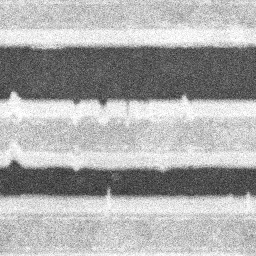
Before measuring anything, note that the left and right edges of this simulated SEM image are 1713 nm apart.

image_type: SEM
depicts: one or a few lines or trenches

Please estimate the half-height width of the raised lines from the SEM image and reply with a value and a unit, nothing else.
333 nanometres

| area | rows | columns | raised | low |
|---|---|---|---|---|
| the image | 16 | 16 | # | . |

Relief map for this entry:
################
################
................
................
................
................
................
################
################
################
................
................
................
################
################
################